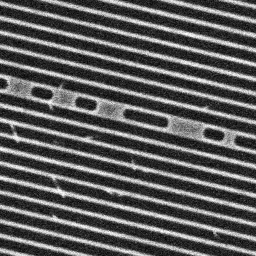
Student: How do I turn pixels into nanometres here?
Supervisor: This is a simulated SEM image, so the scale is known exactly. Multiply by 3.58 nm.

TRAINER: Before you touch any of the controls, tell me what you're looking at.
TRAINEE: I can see parallel lines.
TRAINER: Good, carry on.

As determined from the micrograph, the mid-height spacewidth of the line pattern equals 38.3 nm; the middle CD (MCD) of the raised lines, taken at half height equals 10.5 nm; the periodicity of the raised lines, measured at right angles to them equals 50.5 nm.